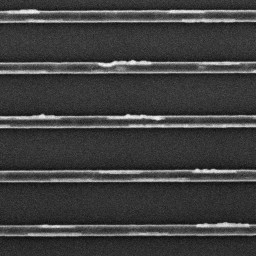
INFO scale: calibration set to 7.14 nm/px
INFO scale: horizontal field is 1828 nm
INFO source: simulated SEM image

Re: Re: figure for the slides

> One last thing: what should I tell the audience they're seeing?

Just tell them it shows parallel lines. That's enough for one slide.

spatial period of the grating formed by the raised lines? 0.382 um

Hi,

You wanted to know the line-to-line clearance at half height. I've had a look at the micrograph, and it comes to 0.304 microns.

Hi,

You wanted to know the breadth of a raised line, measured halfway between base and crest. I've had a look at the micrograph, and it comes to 76.7 nanometers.